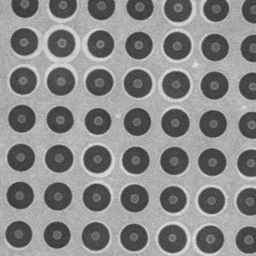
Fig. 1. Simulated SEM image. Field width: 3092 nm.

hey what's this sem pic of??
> an array of small figures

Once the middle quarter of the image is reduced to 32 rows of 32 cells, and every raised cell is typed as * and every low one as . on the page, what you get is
.*******************************
..*****....******...*******..***
...***......****......***......*
...**.......***.......**.......*
...**........**........*........
...**.......***........*........
..****......***.......**........
.******....*****.....****......*
******************..******....**
********************************
********************************
.******...******....******....**
..****.....****......****......*
..***.......***.......**.......*
..***.......***.......**.......*
..***.......***.......**.......*
..****.....****......****......*
*******...******....******....**
********************************
********************************
.******...*******..********.****
..***......****.....*****.....**
..***.......***......***.......*
...**.......**.......***.......*
..***.......**........**.......*
..***.......**.......***.......*
.*****.....****......****......*
*******...*******..*******...***
********************************
********.***********************
.*****.....*****...*******..****
..***.......***......****.....**